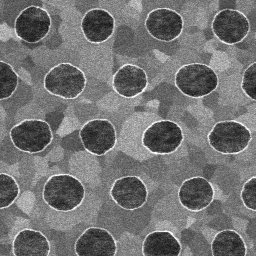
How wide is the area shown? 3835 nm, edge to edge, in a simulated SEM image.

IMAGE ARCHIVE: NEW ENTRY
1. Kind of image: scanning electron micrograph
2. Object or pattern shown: a regular array of holes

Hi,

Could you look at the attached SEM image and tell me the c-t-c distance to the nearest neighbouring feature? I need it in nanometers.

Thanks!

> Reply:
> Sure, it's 960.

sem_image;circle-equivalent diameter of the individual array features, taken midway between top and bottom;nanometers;527